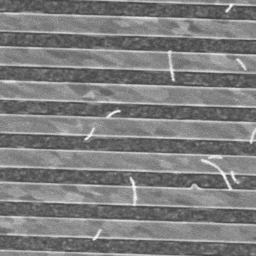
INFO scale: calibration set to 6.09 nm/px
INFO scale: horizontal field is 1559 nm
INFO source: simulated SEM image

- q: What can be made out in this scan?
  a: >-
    parallel lines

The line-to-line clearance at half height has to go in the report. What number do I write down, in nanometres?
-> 94.4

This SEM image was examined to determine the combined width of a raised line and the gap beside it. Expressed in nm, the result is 207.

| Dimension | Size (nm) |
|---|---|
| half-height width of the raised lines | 110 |